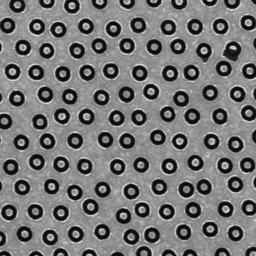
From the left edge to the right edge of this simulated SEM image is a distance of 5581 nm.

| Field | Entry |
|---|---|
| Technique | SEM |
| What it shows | a regular array of ring-shaped grooves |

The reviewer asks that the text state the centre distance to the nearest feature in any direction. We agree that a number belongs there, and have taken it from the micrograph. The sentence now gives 0.505 um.